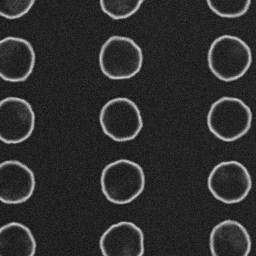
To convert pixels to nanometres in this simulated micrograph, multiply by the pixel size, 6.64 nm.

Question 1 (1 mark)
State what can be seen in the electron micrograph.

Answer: raised bodies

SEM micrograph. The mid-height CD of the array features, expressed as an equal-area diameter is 282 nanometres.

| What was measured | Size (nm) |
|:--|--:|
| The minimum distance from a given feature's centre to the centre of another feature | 409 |